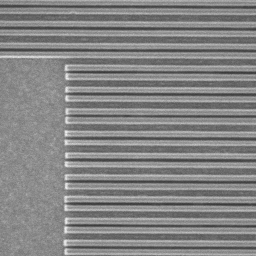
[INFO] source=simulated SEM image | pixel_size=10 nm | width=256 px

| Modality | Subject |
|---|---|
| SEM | parallel lines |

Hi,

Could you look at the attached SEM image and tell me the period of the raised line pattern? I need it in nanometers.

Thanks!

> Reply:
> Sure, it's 110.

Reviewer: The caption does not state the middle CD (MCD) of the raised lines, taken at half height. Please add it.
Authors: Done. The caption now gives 53.9 nm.